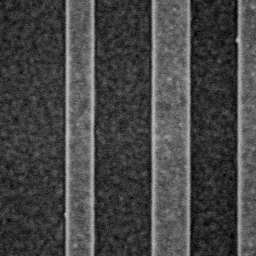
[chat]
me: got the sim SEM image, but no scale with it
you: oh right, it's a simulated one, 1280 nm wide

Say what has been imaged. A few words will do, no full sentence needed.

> one or a few lines or trenches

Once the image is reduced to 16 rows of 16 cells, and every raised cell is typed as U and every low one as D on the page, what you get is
DDDDUUDDDDUUDDDU
DDDDUUDDDDUUDDDU
DDDDUUDDDDUUDDDU
DDDDUUDDDDUUDDDU
DDDDUUDDDDUUDDDU
DDDDUUDDDDUUDDDU
DDDDUUDDDDUUDDDU
DDDDUUDDDDUUDDDU
DDDDUUDDDDUUDDDU
DDDDUUDDDDUUDDDU
DDDDUUDDDDUUDDDU
DDDDUUDDDDUUDDDU
DDDDUUDDDDUUDDDU
DDDDUUDDDDUUDDDU
DDDDUUDDDDUUDDDU
DDDDUUDDDDUUDDDU